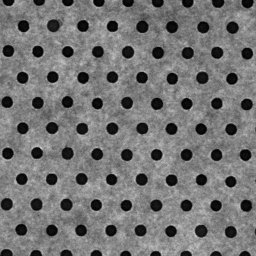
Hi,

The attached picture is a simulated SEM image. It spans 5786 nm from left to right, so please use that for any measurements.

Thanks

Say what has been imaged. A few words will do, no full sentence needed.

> a regular array of holes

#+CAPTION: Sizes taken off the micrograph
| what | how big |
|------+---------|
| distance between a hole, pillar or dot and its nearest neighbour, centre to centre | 29.1 px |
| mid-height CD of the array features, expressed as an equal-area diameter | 272 nanometres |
